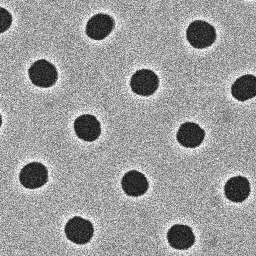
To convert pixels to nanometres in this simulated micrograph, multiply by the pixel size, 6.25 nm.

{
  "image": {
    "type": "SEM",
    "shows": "a regular array of holes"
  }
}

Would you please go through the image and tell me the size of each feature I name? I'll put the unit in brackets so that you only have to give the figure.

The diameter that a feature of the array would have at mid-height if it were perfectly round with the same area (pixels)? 27.4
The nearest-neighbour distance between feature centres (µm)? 0.44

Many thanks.